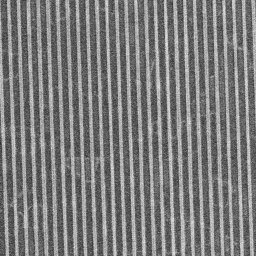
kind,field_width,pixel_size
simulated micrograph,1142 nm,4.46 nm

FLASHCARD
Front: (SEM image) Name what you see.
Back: parallel lines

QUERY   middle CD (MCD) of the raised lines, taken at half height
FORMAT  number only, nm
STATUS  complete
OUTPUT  12.8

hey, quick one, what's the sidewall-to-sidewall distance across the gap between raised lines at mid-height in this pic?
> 31.2 nm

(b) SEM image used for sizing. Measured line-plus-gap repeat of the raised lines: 43.7 nm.